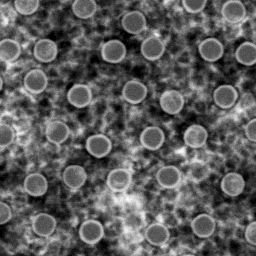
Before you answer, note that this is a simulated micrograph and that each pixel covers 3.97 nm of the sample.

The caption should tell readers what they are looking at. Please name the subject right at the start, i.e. a regular array of raised bodies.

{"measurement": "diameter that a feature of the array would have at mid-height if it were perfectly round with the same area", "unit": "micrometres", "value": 0.0906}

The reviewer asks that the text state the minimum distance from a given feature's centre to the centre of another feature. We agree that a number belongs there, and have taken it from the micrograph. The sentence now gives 162 nm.